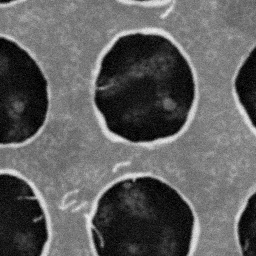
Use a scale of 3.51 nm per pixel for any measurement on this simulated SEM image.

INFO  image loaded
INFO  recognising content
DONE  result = holes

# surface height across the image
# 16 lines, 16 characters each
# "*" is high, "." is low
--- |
****************
****************
.******....*****
..****......****
...***......***.
...***......***.
...***......***.
...***......****
..*****....*****
****************
****************
..*****...******
..****......***.
...***......***.
...***......***.
...***......***.